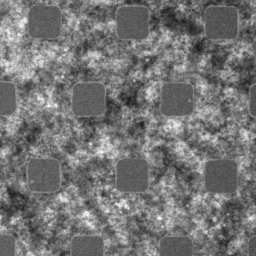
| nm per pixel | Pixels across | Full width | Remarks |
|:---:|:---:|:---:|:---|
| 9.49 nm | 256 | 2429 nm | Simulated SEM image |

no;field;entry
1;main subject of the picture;a regular array of raised bodies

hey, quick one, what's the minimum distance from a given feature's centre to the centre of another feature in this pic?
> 835 nanometres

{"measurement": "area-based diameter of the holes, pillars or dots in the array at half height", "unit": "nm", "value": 356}